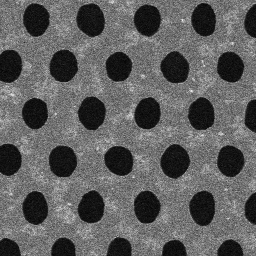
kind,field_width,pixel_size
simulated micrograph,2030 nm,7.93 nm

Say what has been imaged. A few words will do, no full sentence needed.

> a regular array of holes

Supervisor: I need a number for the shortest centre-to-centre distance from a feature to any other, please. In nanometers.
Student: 426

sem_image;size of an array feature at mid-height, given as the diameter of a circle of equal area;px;29.4